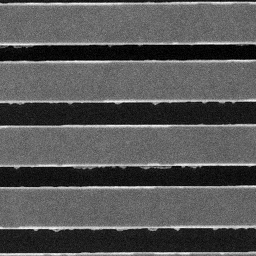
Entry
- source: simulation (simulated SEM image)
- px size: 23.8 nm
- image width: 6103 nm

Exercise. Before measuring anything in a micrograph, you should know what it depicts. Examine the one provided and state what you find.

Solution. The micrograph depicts lines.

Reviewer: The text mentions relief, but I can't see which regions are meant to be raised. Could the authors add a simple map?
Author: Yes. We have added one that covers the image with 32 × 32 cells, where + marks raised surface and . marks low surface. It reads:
.+++++++++++++++++++++++++++++++
++++++++++++++++++++++++++++++++
++++++++++++++++++++++++++++++++
++++++++++++++++++++++++++++++++
++++++++++++++++++++++++++++++++
++++++++++++....................
................................
................................
++++++++++++++++++++++++++++++++
++++++++++++++++++++++++++++++++
++++++++++++++++++++++++++++++++
++++++++++++++++++++++++++++++++
++++++++++++++++++++++++++++++++
................................
................................
................................
++++++++++++++++++++++++++++++++
++++++++++++++++++++++++++++++++
++++++++++++++++++++++++++++++++
++++++++++++++++++++++++++++++++
++++++++++++++++++++++++++++++++
................................
................................
++++++++++++++++++++++++++++++++
++++++++++++++++++++++++++++++++
++++++++++++++++++++++++++++++++
++++++++++++++++++++++++++++++++
++++++++++++++++++++++++++++++++
+++++++++++++++++...............
................................
................................
................................